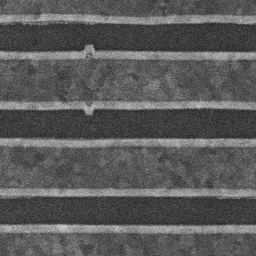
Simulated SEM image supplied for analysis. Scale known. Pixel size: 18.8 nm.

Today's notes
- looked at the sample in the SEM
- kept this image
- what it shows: one or a few lines or trenches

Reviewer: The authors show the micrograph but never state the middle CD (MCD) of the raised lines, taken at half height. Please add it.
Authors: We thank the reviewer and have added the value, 950 nanometres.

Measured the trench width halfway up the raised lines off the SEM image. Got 666 nanometers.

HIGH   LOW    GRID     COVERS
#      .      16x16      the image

################
................
................
###########.###.
################
################
################
................
................
################
################
################
................
................
################
################